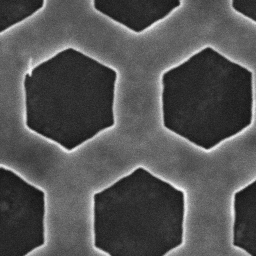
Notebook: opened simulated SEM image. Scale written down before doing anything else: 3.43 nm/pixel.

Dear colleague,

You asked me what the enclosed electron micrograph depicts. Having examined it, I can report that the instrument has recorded holes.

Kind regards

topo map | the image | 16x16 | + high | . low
..++++.....++++.
.+++++++..++++++
++++++++++++++++
+++..+++++++..++
++.....+++......
+......+++......
++.....+++......
++.....+++......
+++...+++++....+
++++++++++++++++
++++++++++++++++
..+++++....+++++
...+++.....++++.
...+++.....++++.
...+++.....++++.
..++++.....++++.